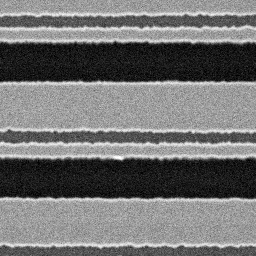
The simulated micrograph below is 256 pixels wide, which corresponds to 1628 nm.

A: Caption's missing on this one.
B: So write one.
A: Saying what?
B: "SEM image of lines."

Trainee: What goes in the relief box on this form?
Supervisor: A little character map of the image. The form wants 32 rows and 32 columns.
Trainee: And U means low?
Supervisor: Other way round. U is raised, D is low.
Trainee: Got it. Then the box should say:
UUUUUUUUUUUUUUUUUUUUUUUUUUUUUUUU
UUUUUUUUUUUUUUUUUUUUUUUUUUUUUUUU
UUUUUUUUUUUUUUUUUUUUUUUUUUUUUUUU
UUUUUUUUUUUUUUUUUUUUUUUUUUUUUUUU
UUUUUUUUUUUUUUUUUUUUUUUUUUUUUUUU
DDDDDDDDDDDDDDDDDDDDDDDDDDDDDDDD
DDDDDDDDDDDDDDDDDDDDDDDDDDDDDDDD
DDDDDDDDDDDDDDDDDDDDDDDDDDDDDDDD
DDDDDDDDDDDDDDDDDDDDDDDDDDDDDDDD
DDDDDDDDDDDDDDDDDDDDDDDDDDDDDDDD
UUUUUUUUUUUUUUUUUUUUUUUUUUUUUUUU
UUUUUUUUUUUUUUUUUUUUUUUUUUUUUUUU
UUUUUUUUUUUUUUUUUUUUUUUUUUUUUUUU
UUUUUUUUUUUUUUUUUUUUUUUUUUUUUUUU
UUUUUUUUUUUUUUUUUUUUUUUUUUUUUUUU
UUUUUUUUUUUUUUUUUUUUUUUUUUUUUUUU
UUUUUUUUUUUUUUUUUUUUUUUUUUUUUUUU
UUUUUUUUUUUUUUUUUUUUUUUUUUUUUUUU
UUUUUUUUUUUUUUUUUUUUUUUUUUUUUUUU
UUUUUUUUUUUUUUUUUUUUUUUUUUUUUUUU
DDDDDDDDDDDDDDDDDDDDDDDDDDDDDDDD
DDDDDDDDDDDDDDDDDDDDDDDDDDDDDDDD
DDDDDDDDDDDDDDDDDDDDDDDDDDDDDDDD
DDDDDDDDDDDDDDDDDDDDDDDDDDDDDDDD
DDDDDDDDDDDDDDDDDDDDDDDDDDDDDDDD
UUUUUUUUUUUUUUUUUUUUUUUUUUUUUUUU
UUUUUUUUUUUUUUUUUUUUUUUUUUUUUUUU
UUUUUUUUUUUUUUUUUUUUUUUUUUUUUUUU
UUUUUUUUUUUUUUUUUUUUUUUUUUUUUUUU
UUUUUUUUUUUUUUUUUUUUUUUUUUUUUUUU
UUUUUUUUUUUUUUUUUUUUUUUUUUUUUUUU
UUUUUUUUUUUUUUUUUUUUUUUUUUUUUUUU